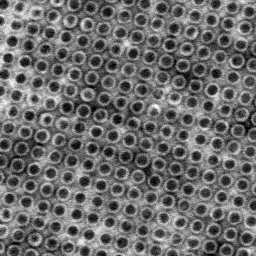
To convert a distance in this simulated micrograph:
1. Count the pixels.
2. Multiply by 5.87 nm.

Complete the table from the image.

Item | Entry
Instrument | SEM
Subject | a regular array of raised bodies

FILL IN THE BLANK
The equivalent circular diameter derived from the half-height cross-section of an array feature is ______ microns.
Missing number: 0.0772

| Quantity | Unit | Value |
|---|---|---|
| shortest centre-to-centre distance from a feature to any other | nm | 98.7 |